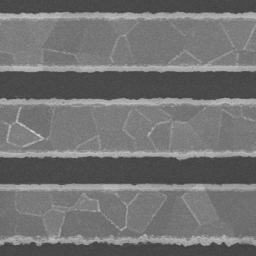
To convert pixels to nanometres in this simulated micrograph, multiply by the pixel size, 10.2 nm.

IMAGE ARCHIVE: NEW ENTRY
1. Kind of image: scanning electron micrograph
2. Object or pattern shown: one or a few lines or trenches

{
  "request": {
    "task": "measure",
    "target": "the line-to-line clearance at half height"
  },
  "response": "334 nm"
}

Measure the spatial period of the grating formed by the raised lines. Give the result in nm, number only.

873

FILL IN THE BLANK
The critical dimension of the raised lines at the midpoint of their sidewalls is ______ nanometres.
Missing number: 537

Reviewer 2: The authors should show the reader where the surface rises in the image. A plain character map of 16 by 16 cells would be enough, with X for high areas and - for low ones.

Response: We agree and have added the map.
----------------
XXXXXXXXXXXXXXXX
XXXXXXXXXXXXXXXX
XXXXXXXXXXXXXXXX
----------------
----------------
XXXXXXXXXXXXXXXX
XXXXXXXXXXXXXXXX
XXXXXXXXXXXXXXXX
XXXXXXXXXXXXXXXX
----------------
----------------
XXXXXXXXXXXXXXXX
XXXXXXXXXXXXXXXX
XXXXXXXXXXXXXXXX
----------------